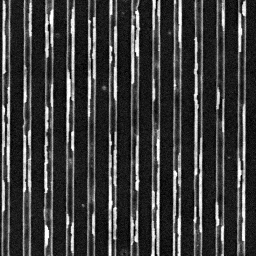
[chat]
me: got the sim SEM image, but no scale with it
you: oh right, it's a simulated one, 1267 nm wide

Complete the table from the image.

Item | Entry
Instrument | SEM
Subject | parallel lines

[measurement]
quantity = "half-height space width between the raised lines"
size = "68.7 nm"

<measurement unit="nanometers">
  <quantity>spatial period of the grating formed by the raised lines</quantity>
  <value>106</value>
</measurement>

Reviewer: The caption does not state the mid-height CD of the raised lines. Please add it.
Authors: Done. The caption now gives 36.5 nm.